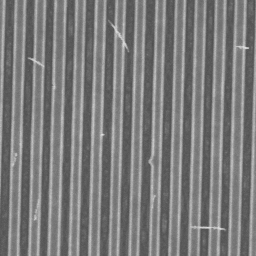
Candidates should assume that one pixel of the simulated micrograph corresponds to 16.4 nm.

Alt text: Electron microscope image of parallel lines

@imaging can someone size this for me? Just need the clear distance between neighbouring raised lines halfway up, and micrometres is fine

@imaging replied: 0.169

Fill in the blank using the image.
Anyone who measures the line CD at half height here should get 0.167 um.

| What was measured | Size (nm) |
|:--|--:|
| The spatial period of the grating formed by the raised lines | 329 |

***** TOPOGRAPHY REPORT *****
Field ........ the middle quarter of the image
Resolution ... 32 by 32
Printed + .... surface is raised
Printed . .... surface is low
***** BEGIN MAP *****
...++...++...++...++...++...++..
...++...++...++...++...++...++..
...++...++...++...++...++...++..
...++...++...++...++...++..+++..
...++...++...++..+++...++..+++..
...++..+++...++..+++...++..+++..
...++..+++...++..+++...++..+++..
...++..+++...++..+++..+++..+++..
...++..+++...++..++...+++..+++..
...++..+++..+++..++...+++..+++..
..+++..+++..+++..++...+++..+++..
..++...+++..+++..++...++...+++..
..++...+++..++...++...++...+++..
..++...+++..++...++...++...+++..
..++...++...++...++...++...++...
..++...++...++...++...++...++...
..++...++...++...++...++...++...
..++...+++..++...++...++...++...
..++...++...++...++...++...++...
..++...++...++...++...++...++...
..++...++...++...++...++...++...
..++...++...++...++...++...++...
..++...++...++...++...++...++...
..++...++...++...++...++...++...
..++...++...++...++..+++...++...
..++...++...++...++...++...++...
..++...++...++...++...++...++...
..++...++...++...++...++...++...
..++...++...++...++...++...++...
..++...++...++...++...++...++...
..++...++...++...++...++...++...
..++...++...++...++...++...++...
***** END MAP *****